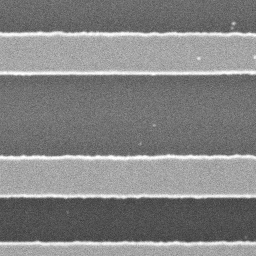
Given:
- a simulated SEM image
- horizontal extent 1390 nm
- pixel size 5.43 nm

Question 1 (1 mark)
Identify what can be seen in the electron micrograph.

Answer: lines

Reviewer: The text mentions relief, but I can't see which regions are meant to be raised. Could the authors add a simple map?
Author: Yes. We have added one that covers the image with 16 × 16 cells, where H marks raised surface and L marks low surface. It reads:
LLLLLLLLLLLLLLLL
LLLLLLLLLLLLLLLL
HHHHHHHHHHHHHHHH
HHHHHHHHHHHHHHHH
HHHHHHHHHHHHHHHH
LLLLLLLLLLLLLLLL
LLLLLLLLLLLLLLLL
LLLLLLLLLLLLLLLL
LLLLLLLLLLLLLLLL
LLLLLLLLLLLLLLLL
HHHHHHHHHHHHHHHH
HHHHHHHHHHHHHHHH
LLLLLLLLLLLLLLLL
LLLLLLLLLLLLLLLL
LLLLLLLLLLLLLLLL
HHHHHHHHHHHHHHHH